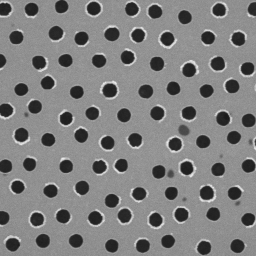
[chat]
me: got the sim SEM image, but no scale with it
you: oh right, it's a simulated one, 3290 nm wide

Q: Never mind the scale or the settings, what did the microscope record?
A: a regular array of holes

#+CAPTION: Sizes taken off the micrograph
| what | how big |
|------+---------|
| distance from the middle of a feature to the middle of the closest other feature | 333 nm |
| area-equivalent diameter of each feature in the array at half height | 177 nm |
